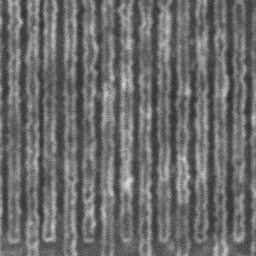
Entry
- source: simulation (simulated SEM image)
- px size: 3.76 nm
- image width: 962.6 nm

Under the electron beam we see parallel lines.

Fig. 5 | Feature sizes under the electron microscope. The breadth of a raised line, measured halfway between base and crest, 38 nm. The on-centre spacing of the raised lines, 70.5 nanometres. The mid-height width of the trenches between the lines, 31.5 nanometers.